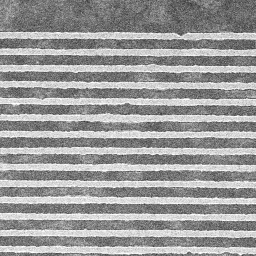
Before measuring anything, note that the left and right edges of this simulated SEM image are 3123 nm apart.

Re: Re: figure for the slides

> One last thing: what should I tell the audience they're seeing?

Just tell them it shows parallel lines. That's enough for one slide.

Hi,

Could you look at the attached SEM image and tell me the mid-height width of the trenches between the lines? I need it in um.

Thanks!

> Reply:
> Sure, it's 0.127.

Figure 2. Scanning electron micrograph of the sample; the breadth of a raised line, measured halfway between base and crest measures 71.7 nm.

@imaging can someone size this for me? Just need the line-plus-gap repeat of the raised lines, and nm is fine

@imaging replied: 201